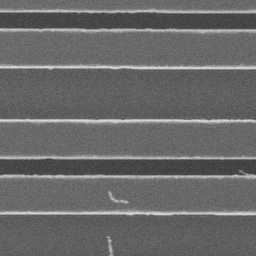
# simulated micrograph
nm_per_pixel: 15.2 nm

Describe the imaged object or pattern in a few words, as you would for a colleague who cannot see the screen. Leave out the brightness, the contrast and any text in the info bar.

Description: lines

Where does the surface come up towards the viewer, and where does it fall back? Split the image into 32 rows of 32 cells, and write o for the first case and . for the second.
oooooooooooooooooooooooooooooooo
...........o.oo.....oooooooooooo
................................
................................
oooooooooooooooooooooooooooooooo
oooooooooooooooooooooooooooooooo
oooooooooooooooooooooooooooooooo
oooooooooooooooooooooooooooooooo
..............o.oooooooooooooooo
................................
................................
................................
................................
................................
................................
oooooooooooooooooooooooooooooooo
oooooooooooooooooooooooooooooooo
oooooooooooooooooooooooooooooooo
oooooooooooooooooooooooooooooooo
oooooooooooooooooooooooooooooooo
................................
................................
oooooooooooooooooooooooooooooooo
oooooooooooooooooooooooooooooooo
oooooooooooooooooooooooooooooooo
oooooooooooooooooooooooooooooooo
oooooooooooooooooooooooooooooooo
................................
................................
................................
................................
................................